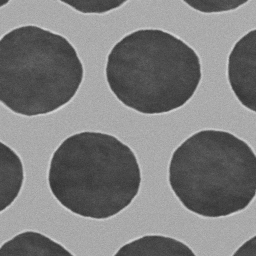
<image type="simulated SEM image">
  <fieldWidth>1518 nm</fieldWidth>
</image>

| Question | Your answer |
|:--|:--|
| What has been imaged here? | holes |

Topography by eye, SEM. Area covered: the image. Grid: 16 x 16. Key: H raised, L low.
HHHHHLLHHHHHLLLH
HHHHHHHHHHHHHHHH
LLLLHHHHLLLHHHHL
LLLLLHHLLLLLHHLL
LLLLLHHLLLLLLHLL
LLLLLHHLLLLLHHHL
LLLLHHHHLLLHHHHL
HHHHHHHHHHHHHHHH
HHHHHLLHHHHHLLLH
LHHLLLLLHHHLLLLL
LHHLLLLLLHHLLLLL
LHHLLLLLLHHLLLLL
LHHHLLLLHHHLLLLL
HHHHHLLHHHHHHLHH
HHHHHHHHHHHHHHHH
LLLLHHHHLLLLHHHL